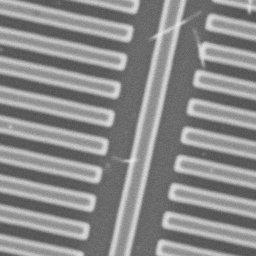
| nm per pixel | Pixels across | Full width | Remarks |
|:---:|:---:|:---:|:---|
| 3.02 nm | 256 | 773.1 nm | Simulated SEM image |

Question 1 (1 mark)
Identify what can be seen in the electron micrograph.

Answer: groups of lines, slits or small figures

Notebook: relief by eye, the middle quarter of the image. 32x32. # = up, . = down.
...........####.......####......
......................####......
###...................####......
#######..............#####......
############.........#####......
#############........####.......
....#########........####.......
........#####........####.......
....................#####.......
#...................####........
#####...............####.......#
##########..........####.......#
############.......#####........
...#########.......####.........
.......#####.......####.........
...................####.........
..................#####........#
###...............#####.......##
#########.........####........##
##########........####........##
.#########........####..........
.....#####........####..........
.................#####..........
.................####........##.
##..............#####.......####
######...........####.......####
#########.......#####........###
#########.......####............
....#####.......####............
................####............
................####............
...............#####.......#####